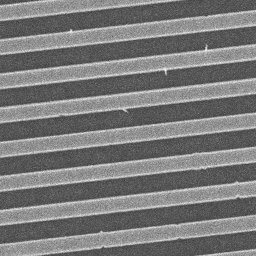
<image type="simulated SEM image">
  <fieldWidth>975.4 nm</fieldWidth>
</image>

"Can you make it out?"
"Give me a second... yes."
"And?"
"parallel lines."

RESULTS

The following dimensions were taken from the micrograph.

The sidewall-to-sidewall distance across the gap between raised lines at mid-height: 75.3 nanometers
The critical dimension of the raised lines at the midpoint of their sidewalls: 55.9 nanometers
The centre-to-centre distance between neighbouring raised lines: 129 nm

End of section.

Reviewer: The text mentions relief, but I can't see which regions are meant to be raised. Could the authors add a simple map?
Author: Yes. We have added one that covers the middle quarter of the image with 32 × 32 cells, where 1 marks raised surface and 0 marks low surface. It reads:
00111111111111111111111111111111
11111111111111111111111100000000
11111111111111100000000000000000
11111100000000000000000000000000
00000000000000000000000000000000
00000000000000000000000000000000
00000000000000000000000001111111
00000000000000001111111111111111
00000000111111111111111111111111
11111111111111111111111111111000
11111111111111111111000000000000
11111111111100000000000000000000
11100000000000000000000000000000
00000000000000000000000000000000
00000000000000000000000000000111
00000000000000000000111111111111
00000000000111111111111111111111
00011111111111111111111111111111
11111111111111111111111100000000
11111111111111110000000000000000
11111110000000000000000000000000
00000000000000000000000000000000
00000000000000000000000000000000
00000000000000000000000000111111
00000000000000000111111111111111
00000000111111111111111111111111
11111111111111111111111111111100
11111111111111111111100000000000
11111111111110000000000000000000
11110000000000000000000000000000
00000000000000000000000000000000
00000000000000000000000000000111